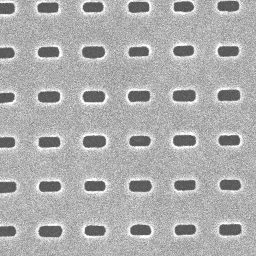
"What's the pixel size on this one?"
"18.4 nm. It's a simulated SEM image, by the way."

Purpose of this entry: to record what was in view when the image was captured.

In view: a regular array of holes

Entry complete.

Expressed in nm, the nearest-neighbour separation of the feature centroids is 812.